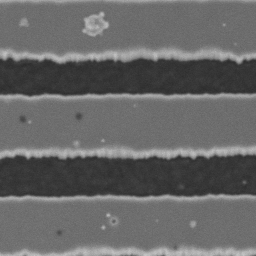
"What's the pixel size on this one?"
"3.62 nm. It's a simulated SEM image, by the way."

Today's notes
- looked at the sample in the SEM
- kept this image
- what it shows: lines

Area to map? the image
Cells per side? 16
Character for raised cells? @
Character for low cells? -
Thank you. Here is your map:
@@@@@@@@@@@@@@@@
@@@@@@@@@@@@@@@@
@@@@@@@@@@@@@@@@
@@@@@@@@@@@@@@@@
----------------
----------------
@@@@@@@@@@@@@@@@
@@@@@@@@@@@@@@@@
@@@@@@@@@@@@@@@@
@@@@@@@@@@@@@@@@
----------------
----------------
@@@@@@@@@@@@@@@@
@@@@@@@@@@@@@@@@
@@@@@@@@@@@@@@@@
@@@@@@@@@@@@@@@@